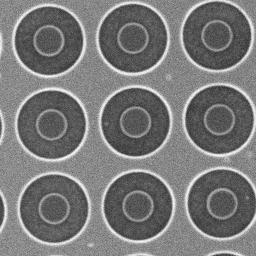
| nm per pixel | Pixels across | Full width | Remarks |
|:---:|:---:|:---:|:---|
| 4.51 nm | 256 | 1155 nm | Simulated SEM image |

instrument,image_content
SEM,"an array of small figures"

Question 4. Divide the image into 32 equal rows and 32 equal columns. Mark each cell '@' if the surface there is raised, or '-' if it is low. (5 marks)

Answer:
@@@@@@@@@@@@@@@@-@@@@@@@@----@@@
@@@@----@@@@@@------@@@@------@@
@@@-------@@@-------@@@--------@
@@---@@---@@@--@@@---@@---@@@--@
@@--@@@@--@@---@@@---@@--@@@@---
@@--@@@@--@@---@@@---@@---@@@--@
@@---@@---@@@---@----@@--------@
@@--------@@@-------@@@@------@@
@@@------@@@@@-----@@@@@@@---@@@
@@@@@@@@@@@@@@@@@@@@@@@@@@@@@@@@
@@@@@@@@@@@@@@@@@@@@@@@@@@@@@@@@
@@@@@---@@@@@@@----@@@@@@-----@@
@@@-------@@@@------@@@@-------@
@@@-------@@@---@@---@@---@@@---
@@---@@@---@@--@@@@--@@---@@@---
@@---@@@---@@--@@@@--@@---@@@---
@@---@@@---@@---@@---@@---@@----
@@@-------@@@--------@@@-------@
@@@-------@@@@------@@@@@-----@@
@@@@-----@@@@@@@--@@@@@@@@@@@@@@
@@@@@@@@@@@@@@@@@@@@@@@@@@@@@@@@
@@@@@@@@@@@@@@@@@-@@@@@@@@----@@
@@@@-----@@@@@------@@@@-------@
@@@-------@@@@-------@@@--------
@@@---@@---@@---@@---@@---@@@---
-@@--@@@@--@@--@@@@---@---@@@@--
-@---@@@@--@@---@@@---@@--@@@---
@@@---@@---@@----@---@@@--------
@@@-------@@@@-------@@@@------@
@@@@-----@@@@@@-----@@@@@@---@@@
@@@@@@@@@@@@@@@@@@@@@@@@@@@@@@@@
@@@@@@@@@@@@@@@@@@@@@@@@@@@@@@@@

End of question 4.